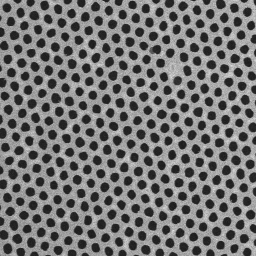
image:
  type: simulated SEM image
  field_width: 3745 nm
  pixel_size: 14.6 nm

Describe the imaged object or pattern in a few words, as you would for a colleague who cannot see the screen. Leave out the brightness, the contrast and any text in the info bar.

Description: a regular array of holes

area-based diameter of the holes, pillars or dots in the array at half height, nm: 132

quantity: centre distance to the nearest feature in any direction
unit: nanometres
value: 200